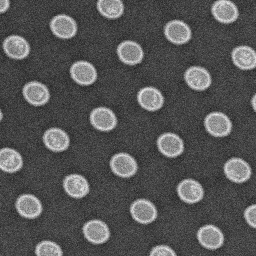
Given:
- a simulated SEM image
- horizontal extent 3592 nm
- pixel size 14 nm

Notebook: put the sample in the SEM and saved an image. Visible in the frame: a regular array of raised bodies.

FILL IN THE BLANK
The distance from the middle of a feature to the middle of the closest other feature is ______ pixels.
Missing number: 50.2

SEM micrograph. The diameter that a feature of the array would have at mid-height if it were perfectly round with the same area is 324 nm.